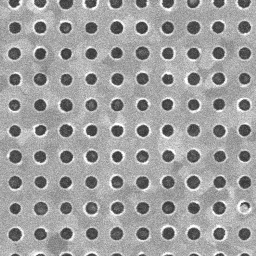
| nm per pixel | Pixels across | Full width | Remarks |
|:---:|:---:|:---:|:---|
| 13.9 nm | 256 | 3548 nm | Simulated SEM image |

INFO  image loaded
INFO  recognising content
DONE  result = a regular array of holes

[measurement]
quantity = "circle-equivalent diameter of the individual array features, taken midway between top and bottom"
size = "177 nanometres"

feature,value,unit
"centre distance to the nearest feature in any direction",25.3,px